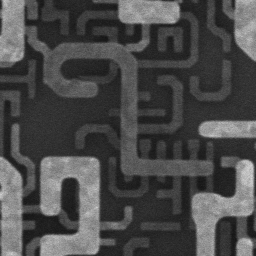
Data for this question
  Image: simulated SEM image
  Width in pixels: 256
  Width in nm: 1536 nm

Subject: wiring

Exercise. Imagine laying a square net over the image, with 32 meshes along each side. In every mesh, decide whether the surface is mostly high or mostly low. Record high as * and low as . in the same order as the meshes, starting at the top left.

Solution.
***............*******.......***
***............*******.......***
***............*******.......***
***..........................***
***..........................***
***.....*******...............**
***...**********...............*
**....**......***...............
.....**........**...............
.....***.......**...............
......******...**...............
.......*****...**...............
...............**...............
...............**...............
...............**...............
...............**........*******
...............**........*******
...............**...............
...............**...............
...............**...............
*....*******...***********....*.
**...*******...***********....**
***..***..**..................**
***..***..**..................**
***..**...**............****.***
***..**...**............********
***..**...**............*******.
***.......**............***.....
***.......**.............**.....
***...******.............**.....
***..*******.............**...*.
***..*******.............**...*.